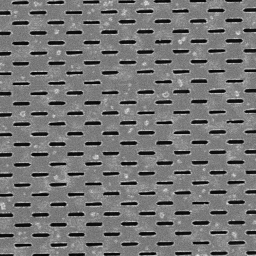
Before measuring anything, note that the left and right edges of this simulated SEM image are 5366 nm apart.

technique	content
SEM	a regular array of holes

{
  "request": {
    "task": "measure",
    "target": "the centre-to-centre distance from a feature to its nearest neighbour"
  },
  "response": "415 nm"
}